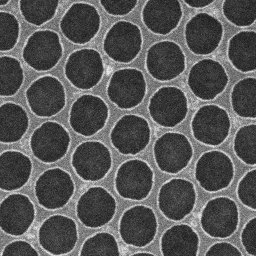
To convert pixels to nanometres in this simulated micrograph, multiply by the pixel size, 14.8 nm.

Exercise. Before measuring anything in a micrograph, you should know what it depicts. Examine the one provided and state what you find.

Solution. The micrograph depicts a regular array of holes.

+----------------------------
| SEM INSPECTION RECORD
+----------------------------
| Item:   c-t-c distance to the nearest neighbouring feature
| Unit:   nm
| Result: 675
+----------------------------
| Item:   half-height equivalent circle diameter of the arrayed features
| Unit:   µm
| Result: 0.59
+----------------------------